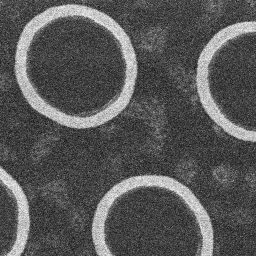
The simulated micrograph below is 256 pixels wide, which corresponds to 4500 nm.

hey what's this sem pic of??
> raised bodies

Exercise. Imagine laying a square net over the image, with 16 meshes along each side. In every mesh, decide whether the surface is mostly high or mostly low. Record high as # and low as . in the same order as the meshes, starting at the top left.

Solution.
................
..#####.........
..######......##
.#######.....###
.#######.....###
..######.....###
..#####......###
....##........##
................
................
................
#.......##......
#......#####....
#.....#######...
#.....#######...
#.....#######...